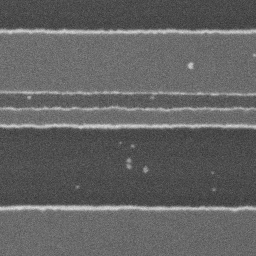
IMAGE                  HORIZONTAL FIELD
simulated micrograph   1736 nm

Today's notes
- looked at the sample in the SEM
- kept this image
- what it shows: lines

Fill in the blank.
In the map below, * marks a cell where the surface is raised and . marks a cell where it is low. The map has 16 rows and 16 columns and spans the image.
................
................
****************
****************
****************
****************
****************
****************
................
................
................
................
................
****************
****************
****************